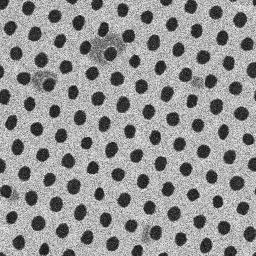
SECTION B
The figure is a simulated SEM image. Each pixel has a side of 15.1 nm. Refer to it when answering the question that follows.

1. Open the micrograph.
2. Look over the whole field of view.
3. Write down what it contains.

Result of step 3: a regular array of holes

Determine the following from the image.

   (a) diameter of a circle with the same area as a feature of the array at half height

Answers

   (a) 200 nm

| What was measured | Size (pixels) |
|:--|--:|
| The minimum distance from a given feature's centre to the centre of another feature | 25.5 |